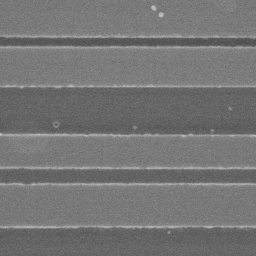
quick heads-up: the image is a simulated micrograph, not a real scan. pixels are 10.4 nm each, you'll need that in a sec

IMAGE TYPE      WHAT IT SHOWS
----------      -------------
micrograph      lines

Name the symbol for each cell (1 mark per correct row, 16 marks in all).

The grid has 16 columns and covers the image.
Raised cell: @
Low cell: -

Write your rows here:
@@@@@@@@@@@@@@@@
@@@@@@@@@@@@@@@@
@@@@@@@@@@@@@@@@
@@@@@@@@@@@@@@@@
@@@@@@@@@@@@@@@@
----------------
----------------
----------------
@@@@@@@@@@@@@@@@
@@@@@@@@@@@@@@@@
@@@@@@@@@@@@@@@@
@@@@@@@@@@@@@@@@
@@@@@@@@@@@@@@@@
@@@@@@@@@@@@@@@@
----------------
----------------